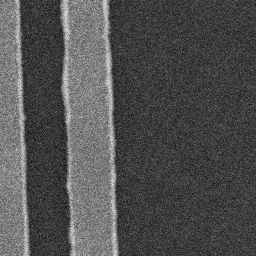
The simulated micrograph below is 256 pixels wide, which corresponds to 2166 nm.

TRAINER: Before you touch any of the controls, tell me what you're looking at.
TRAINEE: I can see one or a few lines or trenches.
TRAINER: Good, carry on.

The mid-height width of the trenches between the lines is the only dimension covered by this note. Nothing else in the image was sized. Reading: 397 nanometers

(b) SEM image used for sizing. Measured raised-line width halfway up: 355 nm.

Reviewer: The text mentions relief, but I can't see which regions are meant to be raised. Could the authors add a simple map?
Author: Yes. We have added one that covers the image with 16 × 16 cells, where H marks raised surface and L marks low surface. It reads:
HLLLHHHLLLLLLLLL
HLLLHHHLLLLLLLLL
HLLLHHHLLLLLLLLL
HLLLHHHLLLLLLLLL
HLLLHHHLLLLLLLLL
HLLLHHHLLLLLLLLL
HLLLHHHLLLLLLLLL
HLLLHHHLLLLLLLLL
HLLLHHHLLLLLLLLL
HLLLHHHLLLLLLLLL
HLLLHHHLLLLLLLLL
HLLLHHHLLLLLLLLL
HLLLHHHLLLLLLLLL
HHLLHHHLLLLLLLLL
HHLLLHHLLLLLLLLL
HHLLLHHLLLLLLLLL